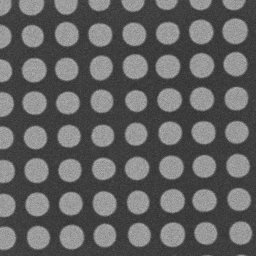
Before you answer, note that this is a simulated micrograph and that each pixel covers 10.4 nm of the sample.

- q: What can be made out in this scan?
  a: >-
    an array of small figures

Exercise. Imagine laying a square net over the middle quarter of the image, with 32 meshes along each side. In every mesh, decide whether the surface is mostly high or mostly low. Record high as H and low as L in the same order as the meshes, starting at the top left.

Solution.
HHHLLLLHHHHHLLLHHHHHHLLHHHHHHLLL
HHHLLLLHHHHHLLLHHHHHHLLHHHHHHLLL
HHHLLLLHHHHHLLLHHHHHLLLLHHHHLLLL
HHLLLLLLHHHLLLLLLHHLLLLLLLLLLLLL
LLLLLLLLLLLLLLLLLLLLLLLLLLLLLLLL
LLLLLLLLLLLLLLLLLLLLLLLLLLLLLLLL
LLLLLLLLLLLLLLLLLLLLLLLLLHHHLLLL
HHHLLLLHHHHLLLLLHHHHLLLLHHHHHLLL
HHHHLLLHHHHHLLLHHHHHHLLHHHHHHLLL
HHHHLLLHHHHHLLLHHHHHHLLHHHHHHLLL
HHHHLLLHHHHHLLLLHHHHLLLLHHHHHLLL
HHHLLLLLHHHLLLLLLHHLLLLLLHHHLLLL
LLLLLLLLLLLLLLLLLLLLLLLLLLLLLLLL
LLLLLLLLLLLLLLLLLLLLLLLLLLLLLLLL
LLLLLLLLLLLLLLLLLLLLLLLLLLLLLLLL
HHLLLLLLHHHLLLLLHHHHLLLLHHHHHLLL
HHHHLLLHHHHHLLLLHHHHHLLLHHHHHLLL
HHHHLLLHHHHHLLLHHHHHHLLLHHHHHLLL
HHHHLLLHHHHHLLLHHHHHLLLLHHHHHLLL
HHHHLLLHHHHHLLLLHHHHLLLLLHHHLLLL
HHHLLLLLLLLLLLLLLLLLLLLLLLLLLLLL
LLLLLLLLLLLLLLLLLLLLLLLLLLLLLLLL
LLLLLLLLLLLLLLLLLLLLLLLLLLLLLLLL
LLLLLLLLLLLLLLLLLHHLLLLLLHHHLLLL
HHHLLLLLHHHHLLLLHHHHHLLLHHHHHHLL
HHHHLLLHHHHHHLLHHHHHHLLLHHHHHHLL
HHHHLLLHHHHHHLLHHHHHHLLLHHHHHHLL
HHHHLLLLHHHHLLLLHHHHHLLLHHHHHLLL
HHHHLLLLHHHLLLLLLHHHLLLLLLHHLLLL
LLLLLLLLLLLLLLLLLLLLLLLLLLLLLLLL
LLLLLLLLLLLLLLLLLLLLLLLLLLLLLLLL
LLLLLLLLLLLLLLLLLLLLLLLLLLHHLLLL